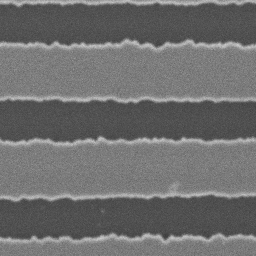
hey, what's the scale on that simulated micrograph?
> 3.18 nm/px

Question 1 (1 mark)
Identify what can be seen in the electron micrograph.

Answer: lines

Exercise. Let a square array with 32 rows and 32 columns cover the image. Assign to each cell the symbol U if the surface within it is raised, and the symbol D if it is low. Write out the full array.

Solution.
DDUDDDDDDDDUUDDDDUUDDDUUUDDUDDDD
DDDDDDDDDDDDDDDDDDDDDDDDDDDDDDDD
DDDDDDDDDDDDDDDDDDDDDDDDDDDDDDDD
DDDDDDDDDDDDDDDDDDDDDDDDDDDDDDDD
DDDDDDDDDDDDDDDDDDDDDDDDDDDDDDDD
UUUUUDDUDUDDDUDUUDUDDUUUUUUUUUDD
UUUUUUUUUUUUUUUUUUUUUUUUUUUUUUUU
UUUUUUUUUUUUUUUUUUUUUUUUUUUUUUUU
UUUUUUUUUUUUUUUUUUUUUUUUUUUUUUUU
UUUUUUUUUUUUUUUUUUUUUUUUUUUUUUUU
UUUUUUUUUUUUUUUUUUUUUUUUUUUUUUUU
UUUUUUUUUUUUUUUUUUUUUUUUUUUUUUUU
DDDDUDDDUUUDDDUUUUDUUUUUUUUUUUUU
DDDDDDDDDDDDDDDDDDDDDDDDDDDDDDDD
DDDDDDDDDDDDDDDDDDDDDDDDDDDDDDDD
DDDDDDDDDDDDDDDDDDDDDDDDDDDDDDDD
DDDDDDDDDDDDDDDDDDDDDDDDDDDDDDDD
DDDDUUDDDDDDUDDDDUUUUDUUUDDDDUUU
UUUUUUUUUUUUUUUUUUUUUUUUUUUUUUUU
UUUUUUUUUUUUUUUUUUUUUUUUUUUUUUUU
UUUUUUUUUUUUUUUUUUUUUUUUUUUUUUUU
UUUUUUUUUUUUUUUUUUUUUUUUUUUUUUUU
UUUUUUUUUUUUUUUUUUUUUUUUUUUUUUUU
UUUUUUUUUUUUUUUUUUUUUUUUUUUUUUUU
UUUUUUUUUUUUUUUUUUUUUDUUDDDDUUDD
DDDDDDDDDDDDDDDDDDDDDDDDDDDDDDDD
DDDDDDDDDDDDDDDDDDDDDDDDDDDDDDDD
DDDDDDDDDDDDDDDDDDDDDDDDDDDDDDDD
DDDDDDDDDDDDDDDDDDDDDDDDDDDDDDDD
DDDDDDDDDDDDDUUDDDUUDDDUDDDUDUDD
UUUUUUUUUUUUUUUUUUUUUUUUUUUUUUUU
UUUUUUUUUUUUUUUUUUUUUUUUUUUUUUUU